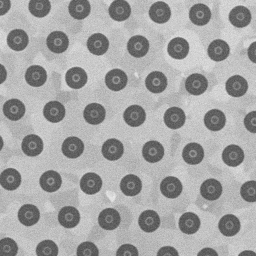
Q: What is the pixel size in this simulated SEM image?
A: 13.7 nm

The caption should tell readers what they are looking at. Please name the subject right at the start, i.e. an array of small figures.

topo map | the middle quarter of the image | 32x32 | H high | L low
HHHLHHHHHHHHHHHHHHHHHHHHHHHHHHHH
HLLLLHHHHHHHLLLHHHHHHHHHHHHHHHHH
LLLLLLHHHHLLLLLLHHHHHLLLLHHHHHHH
LLHHLLHHHHLLLHLLHHHHLLLLLLHHHHHL
LLLLLLHHHHLLLHLLHHHHLLHHLLHHHHLL
HLLLLHHHHHLLLLLLHHHHLLLLLLHHHHLL
HHHHHHHHHHHLLLHHHHHHHLLLLHHHHHHL
HHHHHHHHHHHHHHHHHHHHHHHHHHHHHHHH
HHHHHHHHHHHHHHHHHHHHHHHHHHHHHHHH
HHHHHHHHHHHHHHHHHHHHHHHHHHHHHHHH
HHHHHHLLLLHHHHHHLLLHHHHHHHHHHHHH
HHHHHLLLLLHHHHHLLLLLHHHHHHLLLLHH
HHHHHLLHLLLHHHHLLHLLLHHHHLLLLLHH
HHHHHLLLLLHHHHHLLHLLLHHHHLLHLLLH
HHHHHHLLLLHHHHHLLLLLHHHHHLLLLLHH
HHHHHHHHHHHHHHHHLLLHHHHHHLLLLLHH
HHHHHHHHHHHHHHHHHHHHHHHHHHHHHHHH
HHHHHHHHHHHHHHHHHHHHHHHHHHHHHHHH
HLLLHHHHHHHHLHHHHHHHHHHHHHHHHHHH
LLLLLHHHHHLLLLHHHHHHHLLLHHHHHHHH
LHHLLHHHHLLLLLLHHHHHLLLLLHHHHHLL
LLHLLHHHHLLHHLLHHHHLLLHLLHHHHHLL
LLLLLHHHHLLLLLLHHHHLLLHLLHHHHLLL
HLLHHHHHHHLLLLHHHHHHLLLLLHHHHHLL
HHHHHHHHHHHHHHHHHHHHHLLLHHHHHHLL
HHHHHHHHHHHHHHHHHHHHHHHHHHHHHHHH
HHHHHHHHHHHHHHHHHHHHHHHHHHHHHHHH
HHHHHLLLHHHHHHHHLHHHHHHHHHHHHHHH
HHHHLLLLLHHHHHHLLLLHHHHHHLLLHHHH
HHHHLLHLLLHHHHLLLLLHHHHHLLLLLHHH
HHHHLLHLLLHHHHLLHLLLHHHHLLHHLLHH
HHHHLLLLLHHHHHLLLLLHHHHHLLHLLLHH